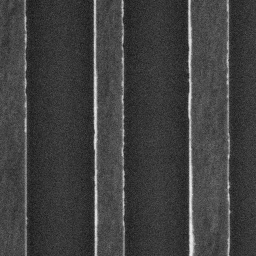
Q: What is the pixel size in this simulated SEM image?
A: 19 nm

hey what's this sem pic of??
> lines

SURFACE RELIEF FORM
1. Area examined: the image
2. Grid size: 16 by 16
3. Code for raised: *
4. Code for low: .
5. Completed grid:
**....**....**..
**....**....**..
**....**....**..
**....**....**..
**....**....**..
**....**....**..
**....**....**..
**....**....**..
**....**....**..
**....**....**..
**....**....**..
**....**....**..
**....**....**..
**....**....**..
**....**....**..
**....**....**..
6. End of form